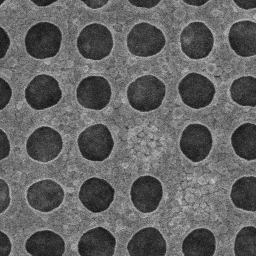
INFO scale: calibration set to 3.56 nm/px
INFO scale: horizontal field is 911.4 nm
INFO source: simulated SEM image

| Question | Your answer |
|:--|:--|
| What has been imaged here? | a regular array of holes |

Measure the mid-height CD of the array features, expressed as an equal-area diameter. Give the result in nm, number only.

130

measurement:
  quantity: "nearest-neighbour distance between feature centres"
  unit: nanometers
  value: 180